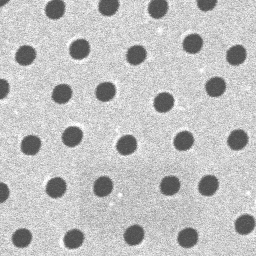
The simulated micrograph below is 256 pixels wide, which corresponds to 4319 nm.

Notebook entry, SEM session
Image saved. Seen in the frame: a regular array of holes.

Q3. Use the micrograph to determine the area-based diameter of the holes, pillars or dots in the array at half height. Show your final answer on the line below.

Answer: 364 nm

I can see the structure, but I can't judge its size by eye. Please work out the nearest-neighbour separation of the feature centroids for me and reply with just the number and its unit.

791 nm